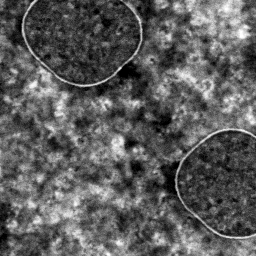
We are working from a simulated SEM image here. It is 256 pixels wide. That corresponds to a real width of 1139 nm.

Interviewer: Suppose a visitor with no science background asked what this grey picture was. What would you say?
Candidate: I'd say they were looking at raised bodies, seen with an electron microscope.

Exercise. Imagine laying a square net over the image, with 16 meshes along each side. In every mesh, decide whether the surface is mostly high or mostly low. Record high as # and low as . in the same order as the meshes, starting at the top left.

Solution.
..######........
.########.......
..#######.......
..######........
...####.........
................
................
................
.............###
............####
...........#####
...........#####
...........#####
............####
.............###
................